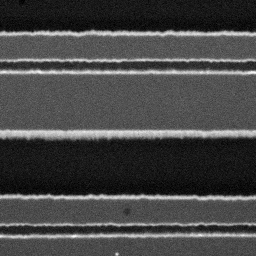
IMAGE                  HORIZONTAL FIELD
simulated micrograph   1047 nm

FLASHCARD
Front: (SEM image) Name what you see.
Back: lines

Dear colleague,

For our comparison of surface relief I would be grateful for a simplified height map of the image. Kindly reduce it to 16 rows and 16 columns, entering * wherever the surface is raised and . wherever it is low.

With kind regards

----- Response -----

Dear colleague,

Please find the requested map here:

................
................
****************
****************
****************
****************
****************
****************
................
................
................
................
****************
****************
****************
****************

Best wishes